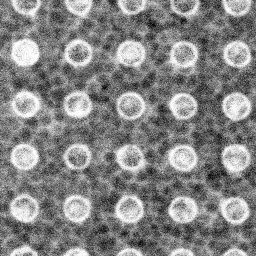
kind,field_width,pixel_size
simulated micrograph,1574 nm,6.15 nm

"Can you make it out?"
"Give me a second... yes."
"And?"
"a regular array of holes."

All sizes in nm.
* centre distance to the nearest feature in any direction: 318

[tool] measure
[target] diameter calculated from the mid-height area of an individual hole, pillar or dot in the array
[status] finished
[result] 0.145 microns